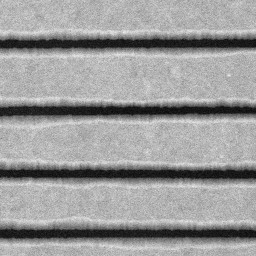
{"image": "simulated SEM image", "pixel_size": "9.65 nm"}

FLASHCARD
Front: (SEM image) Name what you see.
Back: lines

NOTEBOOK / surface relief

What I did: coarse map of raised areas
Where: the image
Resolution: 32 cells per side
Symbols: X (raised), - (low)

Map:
XXXXXXXXXXXXXXXXXXXXXXXXXXXXXXXX
XXXXXXXXXXXXXXXXXXXXXXXXXXXXXXXX
XXXXXXXXXXXXXXXXXXXXXXXXXXXXXXXX
XXXXXXXXXXXXXXXXXXXXXXXXXXXXXXXX
X-XXX------X--X-X---X-----------
--------------------------------
-X----XXXXXXXXXXXXXXX--XXXXXXXXX
XXXXXXXXXXXXXXXXXXXXXXXXXXXXXXXX
XXXXXXXXXXXXXXXXXXXXXXXXXXXXXXXX
XXXXXXXXXXXXXXXXXXXXXXXXXXXXXXXX
XXXXXXXXXXXXXXXXXXXXXXXXXXXXXXXX
XXXXXXXXXXXXXXXXXXXXXXXXXXXXXXXX
XXXXXXXXXXXXXXXXXXXXXXXXXXXXXXXX
--------------------------------
--------------------------------
XXXXXXXXXXXXXXXXXXXXXXXXXXXXXXXX
XXXXXXXXXXXXXXXXXXXXXXXXXXXXXXXX
XXXXXXXXXXXXXXXXXXXXXXXXXXXXXXXX
XXXXXXXXXXXXXXXXXXXXXXXXXXXXXXXX
XXXXXXXXXXXXXXXXXXXXXXXXXXXXXXXX
XXXXXXXXXXXXXXXXXXXXXXXXXXXXXXXX
--------------------------------
--------------------------------
XXXXXXXXXXXXXXXXXXXXXXXXXXXXXXXX
XXXXXXXXXXXXXXXXXXXXXXXXXXXXXXXX
XXXXXXXXXXXXXXXXXXXXXXXXXXXXXXXX
XXXXXXXXXXXXXXXXXXXXXXXXXXXXXXXX
XXXXXXXXXXXXXXXXXXXXXXXXXXXXXXXX
--------------------------------
--------------------------------
XXXXXXXXXXXXXXXXXXXXXXXXXXXXXXXX
XXXXXXXXXXXXXXXXXXXXXXXXXXXXXXXX